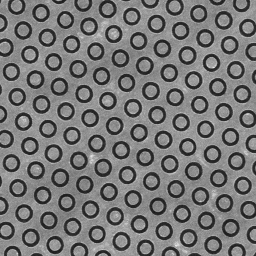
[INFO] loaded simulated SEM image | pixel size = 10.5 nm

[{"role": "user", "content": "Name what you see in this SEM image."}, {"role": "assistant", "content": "a regular array of ring-shaped grooves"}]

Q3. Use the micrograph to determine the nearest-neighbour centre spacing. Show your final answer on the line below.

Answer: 260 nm